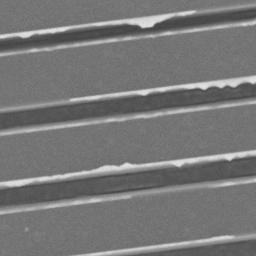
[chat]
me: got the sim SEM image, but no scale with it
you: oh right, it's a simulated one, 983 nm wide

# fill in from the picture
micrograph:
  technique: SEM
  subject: one or a few lines or trenches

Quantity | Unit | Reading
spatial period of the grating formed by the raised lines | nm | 297